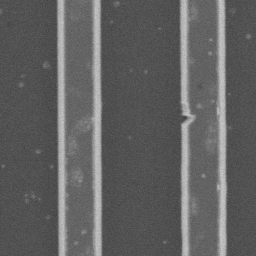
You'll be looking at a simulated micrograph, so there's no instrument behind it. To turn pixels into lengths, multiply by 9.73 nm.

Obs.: one or a few lines or trenches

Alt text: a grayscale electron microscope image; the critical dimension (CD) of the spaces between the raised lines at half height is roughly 0.844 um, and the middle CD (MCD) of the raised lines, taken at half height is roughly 0.359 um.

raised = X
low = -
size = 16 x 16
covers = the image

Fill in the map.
----XX-----XXX--
----XX-----XXX--
----XX-----XXX--
----XX-----XXX--
----XX------XX--
----XX------XX--
----XX------XX--
----XX------XX--
----XX------XX--
----XX------XX--
----XX------XX--
----XX------XX--
----XX------XX--
----XX------XX--
----XX------XX--
----XX------XX--